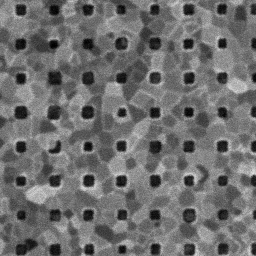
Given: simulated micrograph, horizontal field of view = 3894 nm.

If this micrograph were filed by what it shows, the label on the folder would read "a regular array of holes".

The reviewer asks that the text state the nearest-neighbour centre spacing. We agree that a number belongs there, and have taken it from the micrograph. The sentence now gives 506 nm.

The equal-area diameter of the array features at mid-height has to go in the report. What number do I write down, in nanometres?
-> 196